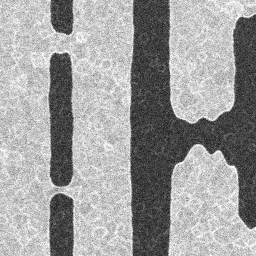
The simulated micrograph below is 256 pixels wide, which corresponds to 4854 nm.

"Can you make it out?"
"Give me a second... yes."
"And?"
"one or a few lines or trenches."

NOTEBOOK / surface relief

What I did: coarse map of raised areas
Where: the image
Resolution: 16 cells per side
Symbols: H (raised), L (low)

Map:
HHHLLHHHLLLHHHHH
HHHLLHHHLLLHHHHL
HHHHHHHHLLLHHHHL
HHHLHHHHLLLHHHHL
HHHLLHHHLLLHHHHL
HHHLLHHHLLLHHHHL
HHHLLHHHLLLHHHLL
HHHLLHHHLLLLLLLL
HHHLLHHHLLLLLLLL
HHHLLHHHLLLLHLLL
HHHLLHHHLLLHHHHL
HHHLHHHHLLLHHHHL
HHHLHHHHLLLHHHHL
HHHLLHHHLLLHHHHL
HHHLLHHHLLLHHHHH
HHHLLHHHLLLHHHHH